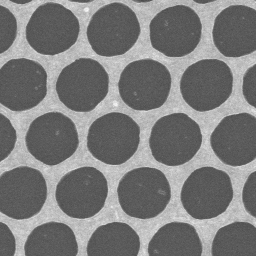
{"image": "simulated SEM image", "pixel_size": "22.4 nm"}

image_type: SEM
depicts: a regular array of holes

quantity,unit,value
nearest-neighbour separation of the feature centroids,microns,1.38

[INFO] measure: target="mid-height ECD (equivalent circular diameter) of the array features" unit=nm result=1190